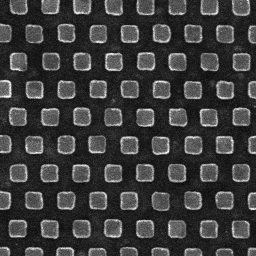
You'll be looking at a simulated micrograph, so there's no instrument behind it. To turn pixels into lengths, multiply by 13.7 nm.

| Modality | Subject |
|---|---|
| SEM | a regular array of raised bodies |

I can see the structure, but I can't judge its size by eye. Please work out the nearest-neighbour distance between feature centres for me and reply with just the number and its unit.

31.4 pixels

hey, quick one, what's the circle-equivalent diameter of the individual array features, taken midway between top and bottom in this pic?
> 259 nanometers